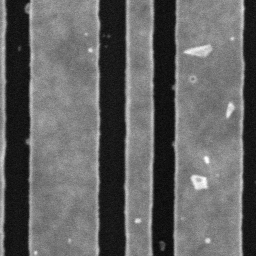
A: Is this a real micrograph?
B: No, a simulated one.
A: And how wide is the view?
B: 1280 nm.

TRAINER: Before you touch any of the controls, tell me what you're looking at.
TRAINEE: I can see lines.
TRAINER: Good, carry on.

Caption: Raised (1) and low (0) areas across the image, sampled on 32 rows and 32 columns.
10001111111100001110001111111100
10001111111100001110001111111100
10001111111100001110001111111100
10001111111100001110001111111100
10001111111100001110001111111100
10001111111100001110001111111100
10001111111100001110001111111100
10001111111100001110001111111110
10001111111100001110001111111110
10001111111100001110001111111100
10001111111100001110001111111100
10001111111100001110001111111100
10001111111100001110001111111100
10001111111100001110001111111100
10001111111100001110001111111100
10001111111100001110001111111100
10001111111100001110001111111100
10001111111100001110001111111100
10001111111100001110001111111100
10001111111100001110001111111100
00001111111100001110001111111100
00001111111100001110001111111100
10001111111100001110001111111100
10001111111100001110001111111100
00001111111100001110001111111100
00001111111100001110001111111100
00001111111100001110001111111100
00001111111100001110001111111100
00001111111100001110001111111100
00001111111100001110001111111100
00001111111100001110001111111100
00001111111100001110001111111100